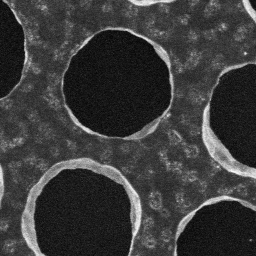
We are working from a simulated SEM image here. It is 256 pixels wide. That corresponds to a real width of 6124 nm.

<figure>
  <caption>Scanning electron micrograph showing holes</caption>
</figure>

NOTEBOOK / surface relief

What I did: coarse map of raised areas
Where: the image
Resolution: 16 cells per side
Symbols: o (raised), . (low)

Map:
.ooooooooooooooo
.ooooooooooooooo
..oooo...ooooooo
..ooo.....oooooo
.ooo.......ooo..
.ooo.......oo...
oooo.......oo...
ooooo.....ooo...
ooooooo..oooo...
oooooooooooooo..
ooo....ooooooooo
oo......oooooooo
oo......oooooo.o
oo......oooo....
oo......ooo.....
oo......ooo.....